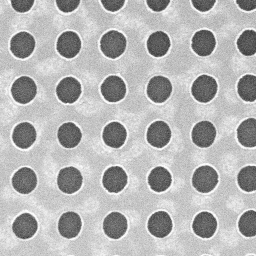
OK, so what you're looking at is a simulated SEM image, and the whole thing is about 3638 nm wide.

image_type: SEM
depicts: a regular array of holes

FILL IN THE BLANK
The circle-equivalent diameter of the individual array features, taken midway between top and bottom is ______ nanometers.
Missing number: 383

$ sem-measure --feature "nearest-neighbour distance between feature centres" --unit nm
638